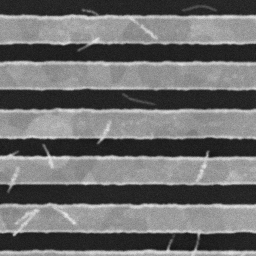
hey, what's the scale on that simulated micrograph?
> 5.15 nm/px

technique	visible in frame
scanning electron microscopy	lines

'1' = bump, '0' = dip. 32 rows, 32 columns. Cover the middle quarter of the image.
11111111111111111111111111111111
11111111111111111111111111111111
11111111111111111111111111111111
11111111111111111111111111111111
11111111111111111111111111111111
11111111111111111111111111111111
00000000000000000000000000000000
00000000000000000000000000000000
00000000000000000000000000000000
00000000000000000000000000000000
00000000000000000000000000000000
11111111000011100111000000000001
11111111111111111111111111111111
11111111111111111111111111111111
11111111111111111111111111111111
11111111111111111111111111111111
11111111111111111111111111111111
11111111111111111111111111111111
00110000010011100111111000111100
00000000000000000000000000000000
00000000000000000000000000000000
00000000000000000000000000000000
00000000000000000000000000000000
11111111111111111111111111111111
11111111111111111111111111111111
11111111111111111111111111111111
11111111111111111111111111111111
11111111111111111111111111111111
11111111111111111111111111111111
11111111111111111111111111111111
00000000000000000000000000000000
00000000000000000000000000000000